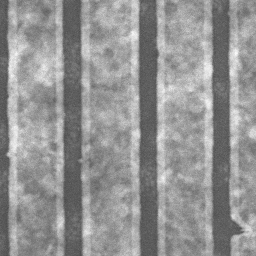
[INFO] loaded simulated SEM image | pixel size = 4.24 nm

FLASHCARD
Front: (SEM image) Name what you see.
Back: one or a few lines or trenches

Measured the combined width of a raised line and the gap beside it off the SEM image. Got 314 nanometres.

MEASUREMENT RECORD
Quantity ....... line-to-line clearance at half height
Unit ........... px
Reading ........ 26.2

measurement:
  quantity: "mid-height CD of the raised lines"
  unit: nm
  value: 201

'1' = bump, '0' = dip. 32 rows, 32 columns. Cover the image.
00111110000111111000111111000111
00111110000111111000111111000111
00111110000111111000111111000111
00111110000111111000111111000111
00111110000111111000111111000111
00111110000111111000111111000111
00111110000111111000111111000111
00111110000111111000111111000111
00111110000111111000111111000111
00111110000111111000111111000111
00111110000111111000111111000111
00111110000111111000111111000111
00111110000111111000111111000111
00111110000111111000111111000111
00111110000111111000111111000111
00111110000111111000111111000111
00111110000111111000111111000111
00111110000111111000111111000111
00111110000111111000111111000111
00111110000111111000111111000111
00111110000111111000111111000111
00111110000111111000111111000111
00111110000111111000111111000111
00111110000111111000111111000111
00111110000111111000111111000111
00111110000111111000111111000111
00111110000111111000111111000111
00111110000111111000111111000011
00111110000111111000111111000001
00111111000111111000111111000011
00111111000111111000111111000111
00111111000111111000111111000111